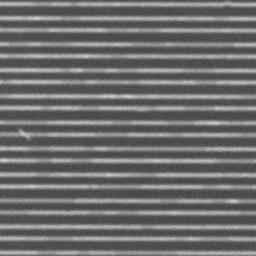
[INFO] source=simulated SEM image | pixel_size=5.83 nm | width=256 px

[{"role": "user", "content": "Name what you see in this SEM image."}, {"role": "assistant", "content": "parallel lines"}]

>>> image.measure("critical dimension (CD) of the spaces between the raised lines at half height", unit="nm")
62.7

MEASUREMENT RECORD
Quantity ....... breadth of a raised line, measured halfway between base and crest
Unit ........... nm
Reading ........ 15.3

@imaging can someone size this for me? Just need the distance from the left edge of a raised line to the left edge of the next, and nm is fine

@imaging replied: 76.3